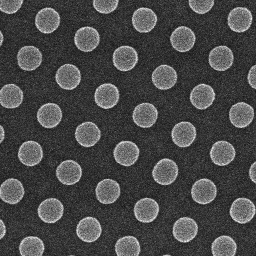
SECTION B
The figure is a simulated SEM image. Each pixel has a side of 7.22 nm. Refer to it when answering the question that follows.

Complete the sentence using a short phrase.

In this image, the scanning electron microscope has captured a regular array of raised bodies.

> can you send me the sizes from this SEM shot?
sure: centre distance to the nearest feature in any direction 305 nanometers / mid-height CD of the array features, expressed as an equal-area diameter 174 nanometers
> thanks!